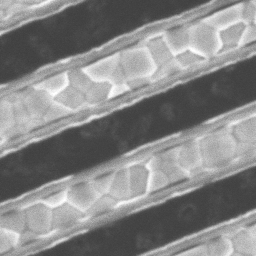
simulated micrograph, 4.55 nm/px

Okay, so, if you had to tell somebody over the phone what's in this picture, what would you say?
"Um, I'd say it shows one or a few lines or trenches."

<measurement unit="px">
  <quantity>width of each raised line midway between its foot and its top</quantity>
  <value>57.6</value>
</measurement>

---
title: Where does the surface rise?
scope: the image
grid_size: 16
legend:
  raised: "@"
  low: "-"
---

---@@@@@@@@@@@--
@@@@@@@@@@@-----
@@@@@@@@--------
@@@@@@---------@
@@@---------@@@@
@---------@@@@@@
-------@@@@@@@@@
----@@@@@@@@@@--
--@@@@@@@@@@----
@@@@@@@@@-------
@@@@@@@-------@@
@@@@--------@@@@
@@-------@@@@@@@
-------@@@@@@@@@
----@@@@@@@@@@--
--@@@@@@@@@-----